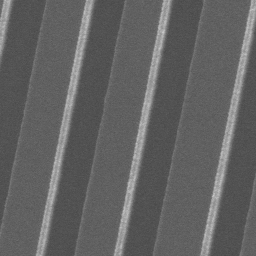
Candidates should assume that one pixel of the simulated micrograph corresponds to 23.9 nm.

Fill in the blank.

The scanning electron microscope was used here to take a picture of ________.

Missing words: lines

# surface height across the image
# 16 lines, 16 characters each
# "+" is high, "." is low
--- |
+..+++..+++..+++
...+++..++..++++
..+++..+++..++++
..+++..+++..+++.
..+++..+++..+++.
..+++..+++..+++.
..+++..++..++++.
.+++..+++..++++.
.+++..+++..+++..
.+++..+++..+++..
.+++..+++..+++..
.+++..++..++++..
+++..+++..++++..
+++..+++..+++..+
+++..+++..+++..+
+++..+++..+++..+